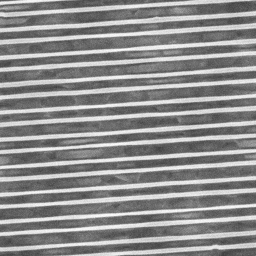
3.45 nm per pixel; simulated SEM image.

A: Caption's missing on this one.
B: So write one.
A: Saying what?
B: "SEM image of parallel lines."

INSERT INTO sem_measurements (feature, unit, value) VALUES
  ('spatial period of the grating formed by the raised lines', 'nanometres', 47.3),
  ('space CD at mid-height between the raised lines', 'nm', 34.9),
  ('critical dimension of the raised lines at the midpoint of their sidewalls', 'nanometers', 12.5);